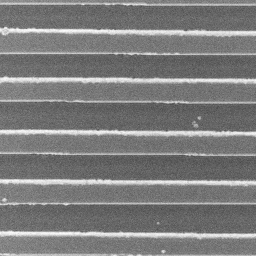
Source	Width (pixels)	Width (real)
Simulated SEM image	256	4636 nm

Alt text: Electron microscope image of lines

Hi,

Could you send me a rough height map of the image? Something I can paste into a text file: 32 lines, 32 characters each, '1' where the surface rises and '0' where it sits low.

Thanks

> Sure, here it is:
00000000000001011111111111111111
00000000000000000000000000000000
00000000000000000000000000000000
00000000000000000000000000000000
11111111111111111111111111111111
11111111111111111111111111111111
11111111111111111111111111111111
00000000000000000000000000000000
00000000000000000000000000000000
00000000000000000000000000000000
11111111111111111111111111111111
11111111111111111111111111111111
11111111111111111111111111111111
00000000000000000000000000000000
00000000000000000000000000000000
00000000000000000000000000000000
11111111110101000000000000000000
11111111111111111111111111111111
11111111111111111111111111111111
00000000000000000000000000000000
00000000000000000000000000000000
00000000000000000000000000000000
00000000000000000000000000000000
11111111111111111111111111111111
11111111111111111111111111111111
11111100100000000000000000000000
00000000000000000000000000000000
00000000000000000000000000000000
00000000000000000000000000000000
11111111111111111111111111111111
11111111111111111111111111111111
11111111111111111111111111111111